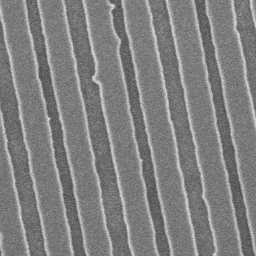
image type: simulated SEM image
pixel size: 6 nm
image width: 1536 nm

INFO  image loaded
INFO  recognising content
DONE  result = parallel lines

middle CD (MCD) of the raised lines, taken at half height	162	nanometres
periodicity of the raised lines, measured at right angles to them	247	nanometres